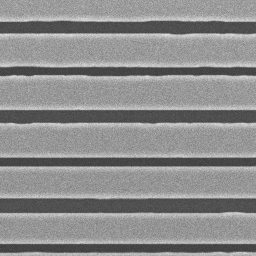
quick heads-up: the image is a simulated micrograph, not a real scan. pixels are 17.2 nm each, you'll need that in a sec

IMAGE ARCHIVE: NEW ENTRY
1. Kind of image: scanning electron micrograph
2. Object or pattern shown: lines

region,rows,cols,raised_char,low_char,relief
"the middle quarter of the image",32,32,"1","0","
11111111111111111111111111111111
00000000000000000000000000000000
00000000000000000000000000000000
11111111111111111111111111111111
11111111111111111111111111111111
11111111111111111111111111111111
11111111111111111111111111111111
11111111111111111111111111111111
11111111111111111111111111111111
11111111111111111111111111111111
11111111111111111111111111111111
00000000000000000000000000000000
00000000000000000000000000000000
00000000000000000000000000000000
00000000000000000000000000000000
11111111111111111111111111111111
11111111111111111111111111111111
11111111111111111111111111111111
11111111111111111111111111111111
11111111111111111111111111111111
11111111111111111111111111111111
11111111111111111111111111111111
11111111111111111111111111111111
00000000000000000000000000000000
00000000000000000000000000000000
00000000000000000000000000000000
11111111111111111111111111111111
11111111111111111111111111111111
11111111111111111111111111111111
11111111111111111111111111111111
11111111111111111111111111111111
11111111111111111111111111111111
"